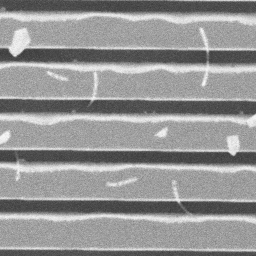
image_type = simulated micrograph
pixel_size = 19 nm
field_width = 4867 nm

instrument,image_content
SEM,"lines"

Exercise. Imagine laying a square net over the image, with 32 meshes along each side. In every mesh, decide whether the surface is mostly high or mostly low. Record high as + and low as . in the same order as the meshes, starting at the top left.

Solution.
................................
................................
++++++++++++++++++++++++++++++++
++++++++++++++++++++++++++++++++
++++++++++++++++++++++++++++++++
++++++++++++++++++++++++++++++++
.++.............................
................................
++++++++++++++++++++++++++++++++
++++++++++++++++++++++++++++++++
++++++++++++++++++++++++++++++++
++++++++++++++++++++++++++++++++
...............................+
................................
+++++++++++++++++++++++++++++...
++++++++++++++++++++++++++++++++
++++++++++++++++++++++++++++++++
++++++++++++++++++++++++++++++++
++++++++++++++++++++++++++++++++
................................
+++.............................
++++++++++++++++++++++++++++++++
++++++++++++++++++++++++++++++++
++++++++++++++++++++++++++++++++
++++++++++++++++++++++++++++++++
................................
................................
++++++++++++++++++++++++++++++++
++++++++++++++++++++++++++++++++
++++++++++++++++++++++++++++++++
++++++++++++++++++++++++++++++++
................................